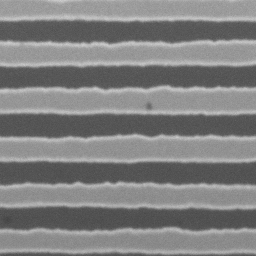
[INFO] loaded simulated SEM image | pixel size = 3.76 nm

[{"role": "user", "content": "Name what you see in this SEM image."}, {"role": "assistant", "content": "lines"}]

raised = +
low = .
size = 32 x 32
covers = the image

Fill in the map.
++++++++++++++++++++++++++++++++
++++++++++++++++++++++++++++++++
...............+..........++....
................................
................................
+++++++++..++..++++++.++++++++++
++++++++++++++++++++++++++++++++
++++++++++++++++++++++++++++++++
................................
................................
................................
++++++++++++++++++++++++++++++++
++++++++++++++++++++++++++++++++
++++++++++++++++++++++++++++++++
................................
................................
................................
++++++++++++++++++++++++++++++++
++++++++++++++++++++++++++++++++
++++++++++++++++++++++++++++++++
................................
................................
................................
++++++++++++++++++++++++++++++++
++++++++++++++++++++++++++++++++
++++++++++++++++++++++++++++++++
................................
................................
................................
++++++++++++++++++++++++++++++++
++++++++++++++++++++++++++++++++
+.....+++++++..+++++++++++++++++